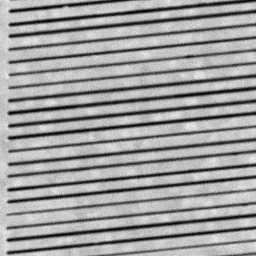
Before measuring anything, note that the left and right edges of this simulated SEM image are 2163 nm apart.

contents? parallel lines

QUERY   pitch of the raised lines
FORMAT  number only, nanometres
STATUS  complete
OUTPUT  107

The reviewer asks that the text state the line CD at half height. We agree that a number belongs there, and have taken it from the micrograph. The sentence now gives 85.1 nanometers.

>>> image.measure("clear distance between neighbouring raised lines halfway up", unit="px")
2.73